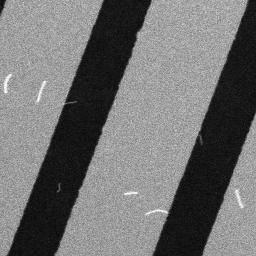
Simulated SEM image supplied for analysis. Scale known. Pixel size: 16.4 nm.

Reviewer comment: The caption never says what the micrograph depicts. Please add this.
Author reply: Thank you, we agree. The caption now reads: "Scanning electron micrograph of one or a few lines or trenches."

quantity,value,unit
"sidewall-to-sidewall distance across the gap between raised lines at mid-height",1460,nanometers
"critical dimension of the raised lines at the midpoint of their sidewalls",0.764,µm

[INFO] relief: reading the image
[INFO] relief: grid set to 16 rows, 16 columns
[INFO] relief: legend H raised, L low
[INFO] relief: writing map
LLLLLLHHHLLLLLLH
LLLLLLHHHLLLLLLH
LLLLLHHHHLLLLLLH
LLLLLHHHLLLLLLHH
LLLLLHHHLLLLLLHH
LLLLHHHLLLLLLHHH
LLLLHHHLLLLLLHHH
LLLLHHHLLLLLLHHH
LLLHHHLLLLLLHHHL
LLLHHHLLLLLLHHHL
LLHHHHLLLLLLHHHL
LLHHHLLLLLLHHHLL
LLHHHLLLLLLHHHLL
LHHHLLLLLLHHHHLL
LHHHLLLLLLHHHLLL
LHHHLLLLLLHHHLLL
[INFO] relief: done